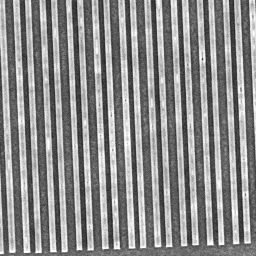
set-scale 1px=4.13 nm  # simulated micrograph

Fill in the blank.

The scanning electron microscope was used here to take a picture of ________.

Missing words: parallel lines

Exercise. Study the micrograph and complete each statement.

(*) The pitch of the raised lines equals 53.9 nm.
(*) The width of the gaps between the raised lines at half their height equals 36.1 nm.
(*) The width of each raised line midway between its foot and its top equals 25.3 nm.